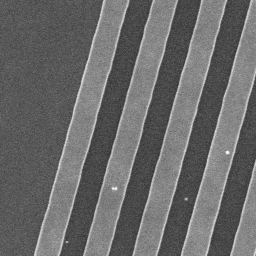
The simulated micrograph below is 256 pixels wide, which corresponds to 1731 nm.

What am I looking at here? groups of lines, slits or small figures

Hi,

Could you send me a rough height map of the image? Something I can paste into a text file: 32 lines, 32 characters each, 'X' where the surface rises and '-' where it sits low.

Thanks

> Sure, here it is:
-------------XXX---XXX---XXX---X
-------------XXX---XXX---XXX---X
------------XXX---XXXX---XXX---X
------------XXX---XXX---XXX---XX
------------XXX---XXX---XXX---XX
-----------XXXX---XXX---XXX---XX
-----------XXX---XXXX---XXX---XX
-----------XXX---XXX---XXX---XXX
-----------XXX---XXX---XXX---XXX
----------XXXX---XXX---XXX---XXX
----------XXX---XXX---XXXX---XXX
----------XXX---XXX---XXX---XXX-
----------XXX---XXX---XXX---XXX-
---------XXX---XXX----XXX---XXX-
---------XXX---XXX---XXX---XXXX-
---------XXX---XXX---XXX---XXX--
--------XXXX---XXX---XXX---XXX--
--------XXX---XXXX--XXXX---XXX--
--------XXX---XXX---XXX---XXX---
--------XXX---XXX---XXX---XXX---
-------XXX---XXXX---XXX---XXX---
-------XXX---XXX---XXXX---XXX---
-------XXX---XXX---XXX---XXX---X
-------XXX---XXX---XXX---XXX---X
------XXX---XXXX---XXX---XXX---X
------XXX---XXX---XXX---XXXX---X
------XXX---XXX---XXX---XXX---XX
-----XXXX---XXX---XXX---XXX---XX
-----XXX---XXX---XXXX---XXX---XX
-----XXX---XXX---XXX---XXX---XXX
-----XXX---XXX---XXX---XXX---XXX
----XXXX--XXXX---XXX---XXX---XXX